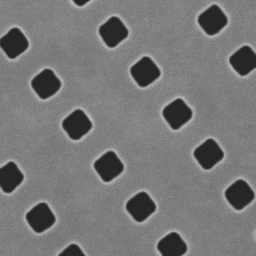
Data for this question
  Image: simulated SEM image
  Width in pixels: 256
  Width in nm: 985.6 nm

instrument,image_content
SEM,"a regular array of holes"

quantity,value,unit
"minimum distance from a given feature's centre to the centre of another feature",198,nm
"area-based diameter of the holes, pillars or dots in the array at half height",106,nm